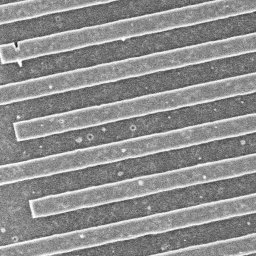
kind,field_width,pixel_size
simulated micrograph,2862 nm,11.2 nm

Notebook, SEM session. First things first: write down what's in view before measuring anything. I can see parallel lines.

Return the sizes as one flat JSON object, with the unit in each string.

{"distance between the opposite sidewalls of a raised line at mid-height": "207 nanometers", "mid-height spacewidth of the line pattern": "234 nm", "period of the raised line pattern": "440 nm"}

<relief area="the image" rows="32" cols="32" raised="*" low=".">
.***********.............*******
*******.............***********.
***............************.....
..........************..........
......***********.............**
..**********.............*******
********............***********.
***.............***********.....
...........***********..........
......***********.............**
.***********.............*******
********............************
***.............***********.....
...........***********..........
......************............**
..***********............*******
..******.............***********
................***********.....
...........************.........
......************.............*
.************............*******
********.............***********
***.............***********.....
...........***********..........
......************............**
....*********.............******
....****.............***********
................***********.....
...........***********..........
......************.............*
..***********.............******
********.............***********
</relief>